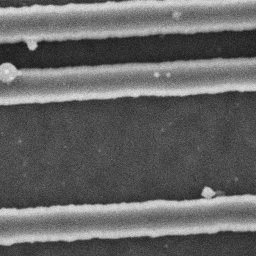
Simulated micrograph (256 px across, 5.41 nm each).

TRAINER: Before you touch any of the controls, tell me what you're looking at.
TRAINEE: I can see lines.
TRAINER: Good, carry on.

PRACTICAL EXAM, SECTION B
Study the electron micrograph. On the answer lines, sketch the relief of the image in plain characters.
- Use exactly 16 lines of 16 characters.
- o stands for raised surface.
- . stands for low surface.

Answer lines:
..oooooooooooooo
oooooooooooooooo
ooo.............
................
oooooooooooooooo
oooooooooooooooo
................
................
................
................
................
................
.............ooo
oooooooooooooooo
ooooooooooooo...
................